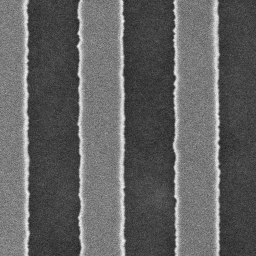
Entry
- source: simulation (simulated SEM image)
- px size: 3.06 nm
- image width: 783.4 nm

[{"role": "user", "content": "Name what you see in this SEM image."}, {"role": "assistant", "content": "lines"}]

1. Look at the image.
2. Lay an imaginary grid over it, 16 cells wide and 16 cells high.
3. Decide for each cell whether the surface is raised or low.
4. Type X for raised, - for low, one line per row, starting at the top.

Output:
XX---XXX---XXX--
XX---XXX---XXX--
XX---XXX---XXX--
XX---XXX---XXX--
XX---XXX---XXX--
XX---XXX---XXX--
XX---XXX---XXX--
XX---XXX---XXX--
XX---XXX---XXX--
XX---XXX---XXX--
XX---XXX---XXX--
XX---XXX---XXX--
XX---XXX---XXX--
XX---XXX---XXX--
XX---XXX---XXX--
XX---XXX---XXX--